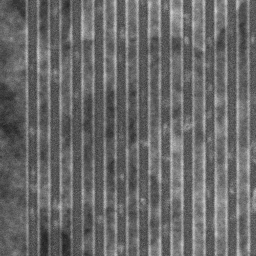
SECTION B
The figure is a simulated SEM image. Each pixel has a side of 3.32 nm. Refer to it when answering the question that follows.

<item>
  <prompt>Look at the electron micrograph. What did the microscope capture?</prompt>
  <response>parallel lines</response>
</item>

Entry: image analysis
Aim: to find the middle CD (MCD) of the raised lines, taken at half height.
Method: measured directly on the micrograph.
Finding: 36.5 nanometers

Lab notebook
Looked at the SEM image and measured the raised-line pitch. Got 0.0735 micrometres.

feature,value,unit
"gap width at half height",36.5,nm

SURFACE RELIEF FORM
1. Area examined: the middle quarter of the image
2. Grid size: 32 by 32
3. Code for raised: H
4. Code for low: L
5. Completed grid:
HHLLLHHLLLHHHLLLHHLLLHHHLLLHHHLL
HHLLLHHLLLHHHLLLHHLLLHHHLLLHHHLL
HHLLLHHLLLHHHLLLHHLLLHHHLLLHHHLL
HHLLLHHLLLHHHLLLHHLLLHHHLLLHHHLL
HHLLLHHLLLHHHLLLHHLLLHHHLLLHHHLL
HHLLLHHLLLHHHLLLHHLLLHHHLLLHHHLL
HHLLLHHLLLHHHLLLHHLLLHHHLLLHHHLL
HHLLLHHLLLHHHLLLHHLLLHHHLLLHHHLL
HHLLLHHLLLHHHLLLHHLLLHHHLLLHHHLL
HHLLLHHLLLHHHLLLHHLLLHHHLLLHHHLL
HHLLLHHLLLHHHLLLHHLLLHHHLLLHHHLL
HHLLLHHLLLHHHLLLHHLLLHHHLLLHHHLL
HHLLLHHLLLHHHLLLHHLLLHHHLLLHHHLL
HHLLLHHLLLHHHLLLHHLLLHHHLLLHHHLL
HHLLLHHLLLHHHLLLHHLLLHHHLLLHHHLL
HHLLLHHLLLHHHLLLHHLLLHHHLLLHHHLL
HHLLLHHLLLHHHLLLHHLLLHHHLLLHHHLL
HHLLLHHLLLHHHLLLHHLLLHHHLLLHHHLL
HHLLLHHLLLHHHLLLHHLLLHHHLLLHHHLL
HHLLLHHLLLHHHLLLHHLLLHHHLLLHHHLL
HHLLLHHLLLHHHLLLHHLLLHHHLLLHHHLL
HHLLLHHLLLHHHLLLHHLLLHHHLLLHHHLL
HHLLLHHLLLHHHLLLHHLLLHHHLLLHHHLL
HHLLLHHLLLHHHLLLHHLLLHHHLLLHHHLL
HHLLLHHLLLHHHLLLHHLLLHHHLLLHHHLL
HHLLLHHLLLHHHLLLHHLLLHHHLLLHHHLL
HHLLLHHLLLHHHLLLHHLLLHHHLLLHHHLL
HHLLLHHLLLHHHLLLHHLLLHHHLLLHHHLL
HHLLLHHLLLHHHLLLHHLLLHHHLLLHHHLL
HHLLLHHLLLHHHLLLHHLLLHHHLLLHHHLL
HHLLLHHLLLHHHLLLHHLLLHHHLLLHHHLL
HHLLLHHLLLHHHLLLHHLLLHHHLLLHHHLL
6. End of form